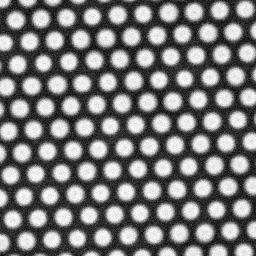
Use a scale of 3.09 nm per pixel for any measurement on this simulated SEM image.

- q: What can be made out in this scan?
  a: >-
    an array of small figures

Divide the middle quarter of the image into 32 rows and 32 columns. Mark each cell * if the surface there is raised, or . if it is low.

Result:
***...***....**....**...........
.*..............................
..........**....***...***....***
...***...****..*****..****..****
*.*****..****..*****..****..****
*.*****..****...***...***....**.
...***....**....................
....................**....**....
.**....***...***...****..****..*
****..****..*****..****..****...
****..****..*****..****..****...
****..****...***....**....**....
***.............................
.................**....***...***
*..****...***...****..*****..***
*..****...****..****..****...***
*..****...***...****...***...***
*...***.........................
..........................***...
........**....***..****...****..
****...****..****..****...****..
****..*****..****..****...****..
****...***....***...**..........
.***....*.......................
.................***...***....**
*...****..****...***...****..***
*...****..****..*****..****..***
*...****..****...***...***....**
*...***....**...................
...........................**...
..*.....**....***...****..****..
.****..****...****..****..****..